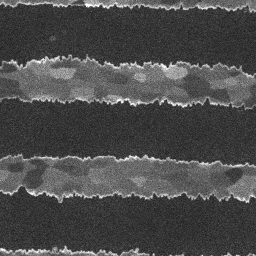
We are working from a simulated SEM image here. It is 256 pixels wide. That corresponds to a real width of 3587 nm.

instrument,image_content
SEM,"one or a few lines or trenches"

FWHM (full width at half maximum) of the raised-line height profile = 0.515 micrometres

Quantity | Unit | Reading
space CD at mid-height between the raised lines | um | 0.804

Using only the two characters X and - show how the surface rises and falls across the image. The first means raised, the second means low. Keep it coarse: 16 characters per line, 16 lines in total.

----------XXX-XX
----------------
----------------
----------------
XXXXXXXXXXXXXXX-
XXXXXXXXXXXXXXXX
-----------X-XXX
----------------
----------------
----------------
XXXXXXXXXXXXXXXX
XXXXXXXXXXXXXXXX
----------------
----------------
----------------
----------------